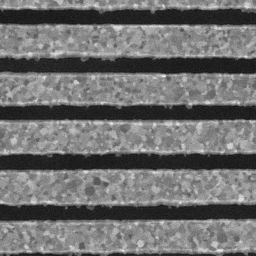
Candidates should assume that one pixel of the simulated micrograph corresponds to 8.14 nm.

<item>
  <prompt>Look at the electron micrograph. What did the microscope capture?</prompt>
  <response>lines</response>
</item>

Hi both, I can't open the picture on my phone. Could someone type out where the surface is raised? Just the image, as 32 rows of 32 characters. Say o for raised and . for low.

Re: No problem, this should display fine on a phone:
oooooooooooooooooooooooooooooooo
................................
................................
oooooooooooooooooooooooooooooooo
oooooooooooooooooooooooooooooooo
oooooooooooooooooooooooooooooooo
oooooooooooooooooooooooooooooooo
................................
................................
oooooooooooooooooooooooooooooooo
oooooooooooooooooooooooooooooooo
oooooooooooooooooooooooooooooooo
oooooooooooooooooooooooooooooooo
................................
................................
oooooooooooooooooooooooooooooooo
oooooooooooooooooooooooooooooooo
oooooooooooooooooooooooooooooooo
oooooooooooooooooooooooooooooooo
................................
................................
oooooooooooooooooooooooooooooooo
oooooooooooooooooooooooooooooooo
oooooooooooooooooooooooooooooooo
oooooooooooooooooooooooooooooooo
.oo....oooooo.ooooo.............
................................
................................
oooooooooooooooooooooooooooooooo
oooooooooooooooooooooooooooooooo
oooooooooooooooooooooooooooooooo
ooo..ooo...ooo..........ooo.....